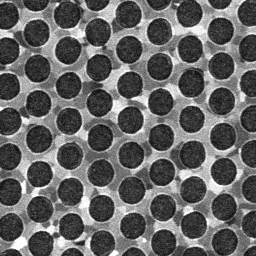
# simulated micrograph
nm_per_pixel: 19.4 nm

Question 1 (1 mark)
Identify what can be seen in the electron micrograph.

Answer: a regular array of holes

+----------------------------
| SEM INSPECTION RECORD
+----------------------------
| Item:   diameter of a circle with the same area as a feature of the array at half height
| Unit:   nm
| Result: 540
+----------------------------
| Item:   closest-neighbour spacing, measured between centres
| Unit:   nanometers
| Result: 680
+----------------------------